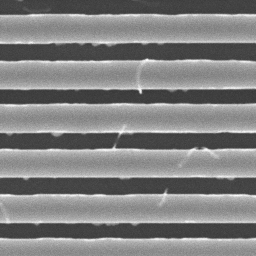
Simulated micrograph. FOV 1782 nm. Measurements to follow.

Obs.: lines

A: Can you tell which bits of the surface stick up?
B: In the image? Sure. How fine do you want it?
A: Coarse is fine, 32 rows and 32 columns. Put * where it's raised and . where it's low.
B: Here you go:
................................
................................
********************************
********************************
********************************
................................
................................
..................*.............
********************************
********************************
********************************
................................
................................
********************************
********************************
********************************
********************************
................................
................................
********************************
********************************
********************************
................................
................................
********************************
********************************
********************************
********************************
................................
................................
********************************
********************************